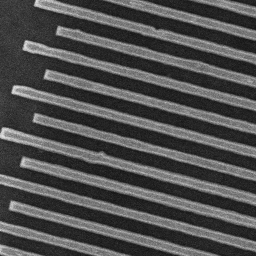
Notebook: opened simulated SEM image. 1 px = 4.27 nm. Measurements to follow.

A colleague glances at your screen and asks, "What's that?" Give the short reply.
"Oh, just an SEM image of parallel lines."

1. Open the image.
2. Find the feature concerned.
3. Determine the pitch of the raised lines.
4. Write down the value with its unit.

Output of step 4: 96.7 nm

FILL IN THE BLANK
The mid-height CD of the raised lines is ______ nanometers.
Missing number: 35.6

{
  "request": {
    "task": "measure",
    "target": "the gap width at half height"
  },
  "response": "0.0587 um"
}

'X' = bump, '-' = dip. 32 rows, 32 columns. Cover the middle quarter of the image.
-------XXXXXXX--------------XXXX
----------XXXXXXXX--------------
--------------XXXXXXXX----------
XXX--------------XXXXXXXXX------
XXXXXXX--------------XXXXXXXX---
--XXXXXXXX---------------XXXXXXX
------XXXXXXXX--------------XXXX
-----------XXXXXXX--------------
X-------------XXXXXXXX----------
XXXX--------------XXXXXXXX------
XXXXXXX---------------XXXXXXXX--
--XXXXXXXXXX-------------XXXXXXX
-------XXXXXXXX--------------XXX
-----------XXXXXXXX-------------
X--------------XXXXXXXX---------
XXXXX-------------XXXXXXXX------
XXXXXXXX--------------XXXXXXXXX-
----XXXXXXXX--------------XXXXXX
-------XXXXXXXXX--------------XX
-----------XXXXXXXX-------------
X--------------XXXXXXXX---------
XXXXX--------------XXXXXXXX-----
XXXXXXXXXX-------------XXXXXXX--
----XXXXXXXXX--------------XXXXX
-------XXXXXXXXX--------------XX
------------XXXXXXX-------------
X--------------XXXXXXXXX--------
XXXXX---------------XXXXXXX-----
XXXXXXXXX---------------XXXXXXX-
-----XXXXXXXX--------------XXXXX
---------XXXXXXXX--------------X
-------------XXXXXXX------------